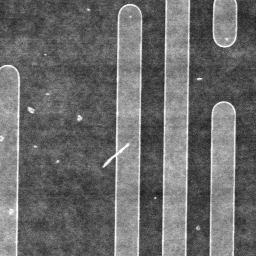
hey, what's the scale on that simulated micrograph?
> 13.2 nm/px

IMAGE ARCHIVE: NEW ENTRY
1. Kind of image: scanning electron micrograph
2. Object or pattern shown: groups of lines, slits or small figures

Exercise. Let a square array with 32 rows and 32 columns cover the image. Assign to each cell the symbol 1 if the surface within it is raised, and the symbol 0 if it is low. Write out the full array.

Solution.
00000000000000000000011100011100
00000000000000011100011100011100
00000000000000011100011100011100
00000000000000011100011100011100
00000000000000011100011100011100
00000000000000011100011100011000
00000000000000011100011100000000
00000000000000011100011100000000
11000000000000011100011100000000
11000000000000011100011100000000
11000000000000011100011000000000
11000000000000011100011000000000
11000000000000011100011000000000
11000000000000011000011000011000
11000000000000011000011000011000
11000000000000011000011000011000
11000000000000011000011000011000
11000000000000011000011000111000
11000000000000011000011000111000
11000000000000111000011000111000
11000000000000011000111000111000
11000000000000011000111000111000
11000000000000011000111000111000
11000000000000111000111000111000
11000000000000111000111000111000
11000000000000111000111000111000
11000000000000111000111000111000
11000000000000111000111000111000
11000000000000111000111000111000
11000000000000111000111000111000
11000000000000111000111000111000
11000000000000111000111000111000